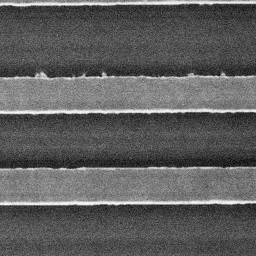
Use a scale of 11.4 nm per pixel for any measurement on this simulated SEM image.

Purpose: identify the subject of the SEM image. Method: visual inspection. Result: lines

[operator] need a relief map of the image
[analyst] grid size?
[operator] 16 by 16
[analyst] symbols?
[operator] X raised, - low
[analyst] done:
----------------
----------------
----------------
----------------
----------------
XXXXXXXXXXXXXXXX
XXXXXXXXXXXXXXXX
----------------
----------------
----------------
-----X---XXXXXXX
XXXXXXXXXXXXXXXX
XXXXXXXXXXXXXXXX
----------------
----------------
----------------